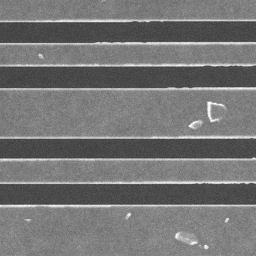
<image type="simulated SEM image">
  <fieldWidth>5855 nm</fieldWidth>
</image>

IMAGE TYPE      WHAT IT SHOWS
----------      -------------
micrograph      lines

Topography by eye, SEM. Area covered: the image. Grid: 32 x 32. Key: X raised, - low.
XXXXXXXXXXXXXXXXXXXXXXXXXXXXXXXX
XXXXXXXXXXXXXXXXXXXXXXXXXXXXXXXX
XXXXXXXXXXXXXXXXXXXXXXXXXXXXXXXX
--------------------------------
--------------------------------
XXXXXXXXXXXXXXXXXXXXXXXXXXXXXXXX
XXXXXXXXXXXXXXXXXXXXXXXXXXXXXXXX
XXXXXXXXXXXXXXXXXXXXXXXXXXXXXXXX
--------------------------------
--------------------------------
--------------------------------
XXXXXXXXXXXXXXXXXXXXXXXXXXXXXXXX
XXXXXXXXXXXXXXXXXXXXXXXXXXXXXXXX
XXXXXXXXXXXXXXXXXXXXXXXXXXXXXXXX
XXXXXXXXXXXXXXXXXXXXXXXXXXXXXXXX
XXXXXXXXXXXXXXXXXXXXXXXXXXXXXXXX
XXXXXXXXXXXXXXXXXXXXXXXXXXXXXXXX
--------------------------------
--------------------------------
--------------------------------
XXXXXXXXXXXXXXXXXXXXXXXXXXXXXXXX
XXXXXXXXXXXXXXXXXXXXXXXXXXXXXXXX
XXXXXXXXXXXXXXXXXXXXXXXXXXXXXXXX
--------------------------------
--------------------------------
--------------------------------
XXXXXXXXXXXXXXXXXXXXXXXXXXXXXXXX
XXXXXXXXXXXXXXXXXXXXXXXXXXXXXXXX
XXXXXXXXXXXXXXXXXXXXXXXXXXXXXXXX
XXXXXXXXXXXXXXXXXXXXXXXXXXXXXXXX
XXXXXXXXXXXXXXXXXXXXXXXXXXXXXXXX
XXXXXXXXXXXXXXXXXXXXXXXXXXXXXXXX